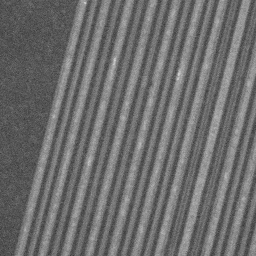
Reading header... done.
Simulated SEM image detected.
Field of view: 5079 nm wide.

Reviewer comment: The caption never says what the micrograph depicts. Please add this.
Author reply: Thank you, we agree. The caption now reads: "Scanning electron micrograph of parallel lines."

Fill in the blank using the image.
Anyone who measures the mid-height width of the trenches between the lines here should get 6.43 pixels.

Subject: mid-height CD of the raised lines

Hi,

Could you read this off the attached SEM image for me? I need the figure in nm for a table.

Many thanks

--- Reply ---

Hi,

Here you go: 128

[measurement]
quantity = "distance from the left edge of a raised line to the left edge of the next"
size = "224 nanometres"